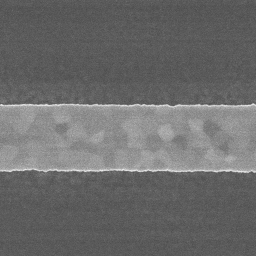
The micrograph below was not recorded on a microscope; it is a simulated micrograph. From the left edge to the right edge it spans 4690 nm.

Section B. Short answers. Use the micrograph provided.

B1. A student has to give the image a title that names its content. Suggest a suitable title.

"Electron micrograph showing one or a few lines or trenches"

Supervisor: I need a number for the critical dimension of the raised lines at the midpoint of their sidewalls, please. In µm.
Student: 1.2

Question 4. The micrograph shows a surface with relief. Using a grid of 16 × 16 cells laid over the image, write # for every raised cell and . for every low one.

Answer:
................
................
................
................
................
................
#...............
################
################
################
################
................
................
................
................
................